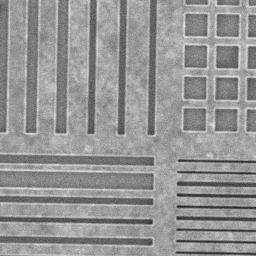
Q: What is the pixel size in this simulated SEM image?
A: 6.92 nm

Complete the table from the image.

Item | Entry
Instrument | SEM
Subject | groups of lines, slits or small figures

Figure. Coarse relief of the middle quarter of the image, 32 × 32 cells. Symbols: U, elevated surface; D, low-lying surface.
DUUUUUDDUUUUUDDDUUUUUDDUUUUUUUDD
DUUUUUDDUUUUUDDDUUUUUDDUUUUUUUUU
DUUUUUDDUUUUUDDDUUUUUDDUUUUUUUUU
DUUUUUDDUUUUUDDDUUUUUDDUUUUUUUDD
DUUUUUDDUUUUUDDDUUUUUDDUUUUUUUDD
DUUUUUDDUUUUUDDUUUUUUDDUUUUUUUDD
DUUUUUDDUUUUUDDUUUUUUDDUUUUUUUDD
DUUUUUDDUUUUUDDUUUUUUDDUUUUUUUDD
DUUUUUDDUUUUUDDUUUUUUDDUUUUUUUDD
DUUUUUDDUUUUUDDUUUUUUDDUUUUUUUUU
DUUUUUDDUUUUUDDUUUUUUDDUUUUUUUUU
DUUUUUDDUUUUUDDUUUUUUDDUUUUUUUDD
DUUUUUDDUUUUUDDUUUUUUDDUUUUUUUDD
DUUUUUDDUUUUUDDUUUUUUDDUUUUUUDDD
DUUUUUDDUUUUUDDUUUUUUDDUUUUUUDDD
DUUUUUDDUUUUUDDUUUUUUDDUUUUUUDDD
DUUUUUDDUUUUUDDUUUUUUDDUUUUUUUDD
DUUUUUDDUUUUUDDUUUUUUDDUUUUUUUUU
UUUUUUUUUUUUUUUUUUUUUUUUUUUUUUUU
UUUUUUUUUUUUUUUUUUUUUUUUUUUUUUUU
UUUUUUUUUUUUUUUUUUUUUUUUUUUUUUUU
UUUUUUUUUUUUUUUUUUUUUUUUUUUUUUUU
UUUUUUUUUUUUUUUUUUUUUUUUUUUUUUUU
DDDDDDDDDDDDDDDDDDDDDDUUUUUUUUUU
DDDDDDDDDDDDDDDDDDDDDDDUUUUUUDDD
UUUUUUUUUUUUUUUUUDDDDDUUUUUUUUUU
UUUUUUUUUUUUUUUUUUUUUUUUUUUUUUUU
DDDDDDDDDDDDDDDDDDDDDDUUUUUUUDDD
DDDDDDDDDDDDDDDDDDDDDDDUUUUUUUUU
DDDDDDDDDDDDDDDDDDDDDDDUUUUUDDDD
DDDDDDDDDDDDDDDDDDDDDDDUUUUUDDDD
UUUUUUDDDDDDDDDDDDDDDDUUUUUUUUUU